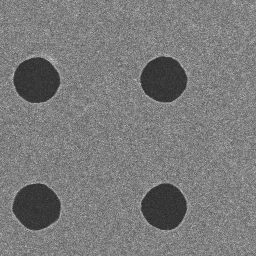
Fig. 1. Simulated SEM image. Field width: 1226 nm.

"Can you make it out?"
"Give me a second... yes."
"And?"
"holes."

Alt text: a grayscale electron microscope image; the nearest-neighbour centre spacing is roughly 606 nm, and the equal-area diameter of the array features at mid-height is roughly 45.9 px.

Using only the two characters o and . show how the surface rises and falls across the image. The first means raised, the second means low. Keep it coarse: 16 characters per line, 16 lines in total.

oooooooooooooooo
oooooooooooooooo
oooooooooooooooo
oooooooooooooooo
o...ooooo...oooo
o...ooooo...oooo
oooooooooooooooo
oooooooooooooooo
oooooooooooooooo
oooooooooooooooo
oooooooooooooooo
oooooooooooooooo
o...ooooo...oooo
o...ooooo...oooo
oooooooooooooooo
oooooooooooooooo